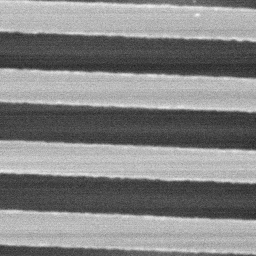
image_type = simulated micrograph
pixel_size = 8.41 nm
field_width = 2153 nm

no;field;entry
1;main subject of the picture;lines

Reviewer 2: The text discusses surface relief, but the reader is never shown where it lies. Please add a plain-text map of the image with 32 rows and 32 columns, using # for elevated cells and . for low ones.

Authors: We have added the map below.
#############...................
################################
################################
################################
.................###############
................................
................................
................................
................................
#####################...........
################################
################################
################################
....................############
................................
................................
................................
................................
#####################...........
################################
################################
################################
..........................######
................................
................................
................................
#####...........................
###########################.....
################################
################################
.###############################
..........................######